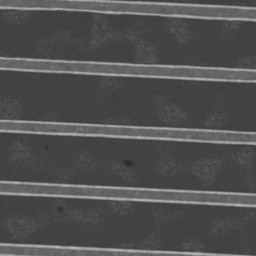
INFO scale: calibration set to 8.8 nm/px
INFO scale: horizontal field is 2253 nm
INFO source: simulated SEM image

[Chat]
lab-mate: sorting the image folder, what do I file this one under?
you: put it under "one or a few lines or trenches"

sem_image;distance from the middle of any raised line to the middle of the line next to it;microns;0.545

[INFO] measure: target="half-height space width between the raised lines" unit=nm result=450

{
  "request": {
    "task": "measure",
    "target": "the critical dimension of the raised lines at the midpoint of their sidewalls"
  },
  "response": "93.3 nm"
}